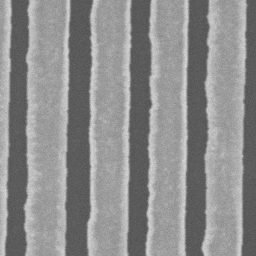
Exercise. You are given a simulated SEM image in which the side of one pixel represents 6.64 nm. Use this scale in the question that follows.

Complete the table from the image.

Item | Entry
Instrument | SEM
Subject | lines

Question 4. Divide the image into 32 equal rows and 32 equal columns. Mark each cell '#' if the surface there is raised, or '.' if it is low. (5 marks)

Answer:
#...#####...####...####....###..
#...#####...####...####...####..
#...#####..#####...####...####..
#...####....####...####....###..
#...####....####...####...####..
#...####....####...####...####..
#...####....####...####...####..
#...####....####...####...####..
#...####....####...####...####..
#...####....####...####...####..
#...####....####...####...####..
#...####...#####...####...####..
#...####...#####...####...####..
#...####...#####...####...####..
#...####...#####...####...####..
#...####...#####...####...####..
#...####...#####...####...####..
#...####...#####...####...####..
#...####...#####...####...####..
#...####....####...####...####..
#...####....####...####...####..
#...####....####...####...####..
#...####....####...####...####..
#...####....####...####...####..
#...####...#####...####...####..
#...####....####...####...####..
#...####....####...####...####..
#...####...#####...####...####..
#...####...#####...####...####..
#...####...#####...####...####..
....####...#####...####...####..
....####...#####...####...####..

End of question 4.